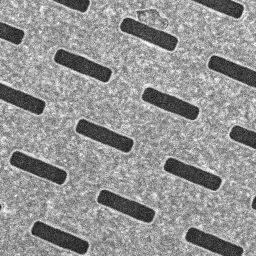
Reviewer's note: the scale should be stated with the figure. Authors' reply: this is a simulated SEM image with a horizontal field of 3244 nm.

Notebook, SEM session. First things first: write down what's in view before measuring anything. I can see a regular array of holes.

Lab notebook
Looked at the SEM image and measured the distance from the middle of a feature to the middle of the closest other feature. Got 73.4 pixels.